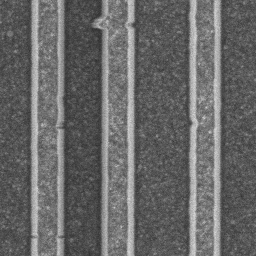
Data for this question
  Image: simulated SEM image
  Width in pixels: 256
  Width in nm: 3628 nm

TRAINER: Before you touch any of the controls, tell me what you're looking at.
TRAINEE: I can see one or a few lines or trenches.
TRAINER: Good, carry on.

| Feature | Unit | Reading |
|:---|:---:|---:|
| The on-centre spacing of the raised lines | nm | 1120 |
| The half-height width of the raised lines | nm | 377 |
